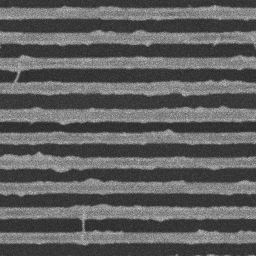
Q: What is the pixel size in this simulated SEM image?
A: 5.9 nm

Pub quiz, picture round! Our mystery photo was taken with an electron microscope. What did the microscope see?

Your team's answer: parallel lines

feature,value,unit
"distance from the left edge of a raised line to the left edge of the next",147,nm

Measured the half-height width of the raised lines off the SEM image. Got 74.5 nm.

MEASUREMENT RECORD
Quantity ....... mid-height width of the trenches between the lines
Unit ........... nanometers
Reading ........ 74.5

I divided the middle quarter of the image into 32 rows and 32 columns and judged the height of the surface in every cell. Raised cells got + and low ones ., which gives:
++++++++++++++++++++++++++++++++
................................
................................
................................
..........................+++...
++++++++++++++++++++++++++++++++
++++++++++++++++++++++++++++++++
+....+.......+......++++++...+++
................................
................................
................................
++++++++++++++++++++++++++++++++
++++++++++++++++++++++++++++++++
++++++++++++++++++++++++++++++++
+++.+..+...........++.....++....
................................
................................
++++++++++++++++++++++++++++++++
++++++++++++++++++++++++++++++++
++++++++++++++++++++++++++++++++
................................
................................
................................
++++.+..+++++++++++...+++..+++++
++++++++++++++++++++++++++++++++
++++++++++++++++++++++++++++++++
+...............................
................................
................................
..++++++++++++............++++..
++++++++++++++++++++++++++++++++
++++++++++++++++++++++++++++++++